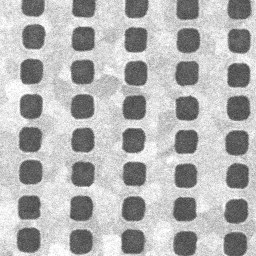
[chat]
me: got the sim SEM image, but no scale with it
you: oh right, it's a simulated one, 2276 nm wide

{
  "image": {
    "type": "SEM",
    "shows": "a regular array of holes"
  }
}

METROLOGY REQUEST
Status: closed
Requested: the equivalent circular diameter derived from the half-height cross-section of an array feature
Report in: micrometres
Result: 0.24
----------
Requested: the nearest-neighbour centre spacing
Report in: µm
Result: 0.297